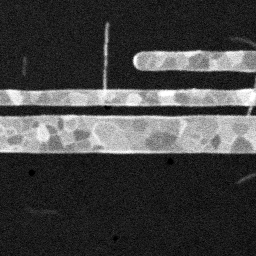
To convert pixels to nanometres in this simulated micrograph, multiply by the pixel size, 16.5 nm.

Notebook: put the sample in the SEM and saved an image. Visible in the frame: groups of lines, slits or small figures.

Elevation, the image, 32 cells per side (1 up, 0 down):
00000000000000000000000000000000
00000000000000000000000000000000
00000000000000000000000000000000
00000000000000000000000000000000
00000000000000000000000000000000
00000000000000000000000000000000
00000000000000000000000000000000
00000000000000000111111111111111
00000000000000000111111111111111
00000000000000000000000000000000
00000000000000000000000000000000
11100111111111111111111111111111
11111111111111111111111111111111
00000000000000000000000000000000
00000000000000000000000000000000
11111111111111111111111111111111
11111111111111111111111111111111
11111111111111111111111111111111
11111111111111111111111111111111
00000000000000000000000000000000
00000000000000000000000000000000
00000000000000000000000000000000
00000000000000000000000000000000
00000000000000000000000000000000
00000000000000000000000000000000
00000000000000000000000000000000
00000000000000000000000000000000
00000000000000000000000000000000
00000000000000000000000000000000
00000000000000000000000000000000
00000000000000000000000000000000
00000000000000000000000000000000